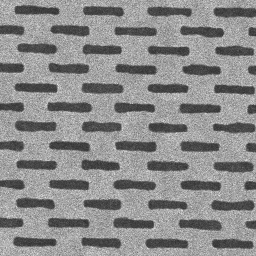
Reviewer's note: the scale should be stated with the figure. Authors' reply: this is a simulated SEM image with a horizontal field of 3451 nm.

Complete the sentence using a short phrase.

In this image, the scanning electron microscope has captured a regular array of holes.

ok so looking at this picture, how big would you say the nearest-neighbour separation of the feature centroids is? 497 nm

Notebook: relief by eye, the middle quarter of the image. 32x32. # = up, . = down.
......#######..........#######..
......#######..........#######..
#....############......########.
################################
################################
####...........######..........#
#####..........######..........#
############.###################
################################
#############..#################
.......######..........######...
.......######..........######...
##############################..
################################
#####...########################
#####..........######..........#
#####.........#######..........#
################################
################################
.....########......###########..
......#######..........######...
......########.........#######..
################################
################################
####.......##########.......####
####..........#######..........#
#####.#.......#######..........#
################################
################################
......#######.........#######...
......#######..........######...
#.....###############.#########.